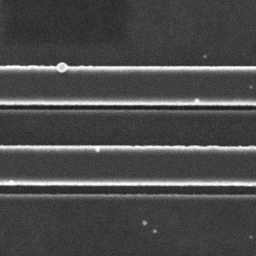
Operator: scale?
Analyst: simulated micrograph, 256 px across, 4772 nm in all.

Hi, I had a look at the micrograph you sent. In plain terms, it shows lines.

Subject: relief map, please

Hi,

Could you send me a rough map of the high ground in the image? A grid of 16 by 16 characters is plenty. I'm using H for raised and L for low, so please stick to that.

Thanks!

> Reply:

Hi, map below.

LLLLLLLLLLLLLLLL
LLLLLLLLLLLLLLLL
LLLLLLLLLLLLLLLL
LLLLLLLLLLLLLLLL
HHHHHHHHHHHHHHHH
HHHHHHHHHHHHHHHH
LLLLLLLLLHHHHHHH
LLLLLLLLLLLLLLLL
LLLLLLLLLLLLLLLL
HHHHHHHHHHHHHHHH
HHHHHHHHHHHHHHHH
LLHLHHHHHHHHHHHH
LLLLLLLLLLLLLLLL
LLLLLLLLLLLLLLLL
LLLLLLLLLLLLLLLL
LLLLLLLLLLLLLLLL